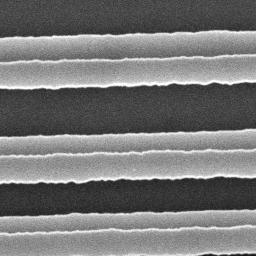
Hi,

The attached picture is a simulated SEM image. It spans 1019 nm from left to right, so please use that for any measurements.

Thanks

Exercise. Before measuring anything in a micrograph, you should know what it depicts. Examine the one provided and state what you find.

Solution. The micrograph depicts lines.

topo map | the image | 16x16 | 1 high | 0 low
0000000000000000
0000000000000000
1111111111111111
1111111111111111
1111111111111111
1111000000000000
0000000000000000
0000000000000000
0001111111111111
1111111111111111
1111111111111111
0000000000000000
0000000000000000
0001111111111111
1111111111111111
1111111111111111